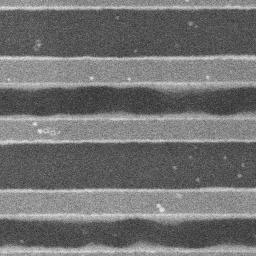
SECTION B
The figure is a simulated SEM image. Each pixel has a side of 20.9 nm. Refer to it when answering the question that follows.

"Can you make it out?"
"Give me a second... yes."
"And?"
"lines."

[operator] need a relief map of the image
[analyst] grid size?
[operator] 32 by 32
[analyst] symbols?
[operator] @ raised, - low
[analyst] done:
@@@@@@@@@@@@@@@@@@@@@@@@@@@@@@@@
--------------------------------
--------------------------------
--------------------------------
--------------------------------
--------------------------------
--------------------------------
@@@@@@@@@@@@@@@@@@@@@@@@@@@@@@@@
@@@@@@@@@@@@@@@@@@@@@@@@@@@@@@@@
@@@@@@@@@@@@@@@@@@@@@@@@@@@@@@@@
@@@@@@--------------@@@@--------
--------------------------------
--------------------------------
--------------------------------
--------------------------------
@@@@@@@@@@@@@@@@@@@@@@@@@@@@@@@@
@@@@@@@@@@@@@@@@@@@@@@@@@@@@@@@@
@@@@@@@@@@@@@@@@@@@@@@@@@@@@@@@@
--------------------------------
--------------------------------
--------------------------------
--------------------------------
--------------------------------
--------------------------------
@@@@@@@@@@@@@@@@@@@@@@@@@@@@@@@@
@@@@@@@@@@@@@@@@@@@@@@@@@@@@@@@@
@@@@@@@@@@@@@@@@@@@@@@@@@@@@@@@@
--------------------------------
--------------------------------
--------------------------------
--------------------------------
@@@@@@@@@@@@@@@@@@@@@@@@@@@@@@@@